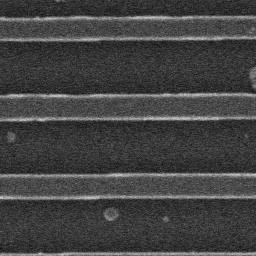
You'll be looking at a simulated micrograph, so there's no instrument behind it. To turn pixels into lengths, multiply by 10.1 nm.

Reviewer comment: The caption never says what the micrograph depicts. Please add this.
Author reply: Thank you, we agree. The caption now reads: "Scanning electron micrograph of lines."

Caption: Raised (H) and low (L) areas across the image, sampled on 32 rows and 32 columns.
LLLLLLLLLLLLLLLLLLLLLLLLLLLLLLLL
LLLLLLLLLLLLLLLLLLLLLLLLLLLLLLLL
HHHHHHHHHHHHHHHHHHHHHHHHHHHHHHHH
HHHHHHHHHHHHHHHHHHHHHHHHHHHHHHHH
HHHHHHHHHHHHHHHHHHHHHHHHHHHHHHHH
LLLLLLLLLLLLLLLLLLLLLLLLLLLLLLLL
LLLLLLLLLLLLLLLLLLLLLLLLLLLLLLLL
LLLLLLLLLLLLLLLLLLLLLLLLLLLLLLLL
LLLLLLLLLLLLLLLLLLLLLLLLLLLLLLLL
LLLLLLLLLLLLLLLLLLLLLLLLLLLLLLLL
LLLLLLLLLLLLLLLLLLLLLLLLLLLLLLLL
LLLLLLLLLLLLLLLLLLLLLLLLLLLLLLLL
HHHHHHHHHHHHHHHHHHHHHHHHHHHHHHHH
HHHHHHHHHHHHHHHHHHHHHHHHHHHHHHHH
HHHHHHHHHHHHHHHHHHHHHHHHHHHHHHHH
LLLLLLLLLLLLLLLLLLLLLLLLLLLLLLLL
LLLLLLLLLLLLLLLLLLLLLLLLLLLLLLLL
LLLLLLLLLLLLLLLLLLLLLLLLLLLLLLLL
LLLLLLLLLLLLLLLLLLLLLLLLLLLLLLLL
LLLLLLLLLLLLLLLLLLLLLLLLLLLLLLLL
LLLLLLLLLLLLLLLLLLLLLLLLLLLLLLLL
LLLLLLLLLLLLLLLLLLLLLLLLLLLLLLLL
HHHHHHHHHHHHHHHHHHHHHHHHHHHHHHHH
HHHHHHHHHHHHHHHHHHHHHHHHHHHHHHHH
HHHHHHHHHHHHHHHHHHHHHHHHHHHHHHHH
LLLLLLLLLLLLLLLLLLLLLLLLLLLLLLLL
LLLLLLLLLLLLLLLLLLLLLLLLLLLLLLLL
LLLLLLLLLLLLLLLLLLLLLLLLLLLLLLLL
LLLLLLLLLLLLLLLLLLLLLLLLLLLLLLLL
LLLLLLLLLLLLLLLLLLLLLLLLLLLLLLLL
LLLLLLLLLLLLLLLLLLLLLLLLLLLLLLLL
LLLLLLLLLLLLLLLLLLLLLLLLLLLLLLLL